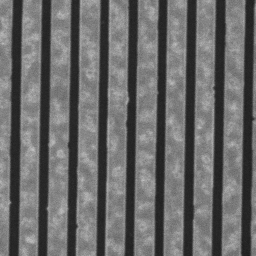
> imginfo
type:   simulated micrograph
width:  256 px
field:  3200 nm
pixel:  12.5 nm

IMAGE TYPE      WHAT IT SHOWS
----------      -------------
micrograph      parallel lines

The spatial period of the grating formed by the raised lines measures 29 px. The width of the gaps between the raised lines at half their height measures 133 nm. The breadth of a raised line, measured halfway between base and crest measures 222 nm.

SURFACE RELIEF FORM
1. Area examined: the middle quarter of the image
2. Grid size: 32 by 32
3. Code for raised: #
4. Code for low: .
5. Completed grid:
#...####....####...####...####..
#...####....####...####...####..
#...####....####...####...####..
#...####...####....####...####..
#...####...####....####...####..
#...####...####...#####...####..
#...####...####...#####...####..
#...####...#####..#####...####..
#...####...#####..#####...####..
#...####...#####...####...####..
#...####...####...#####...####..
#...####...####...#####...####..
#...####...####...#####...####..
#...####...####...#####...####..
#...####...####...#####...####..
#...####...####...#####...####..
#...####...####...#####...####..
#...####...####...#####...####..
#...####...####...#####...####..
#...####...####...#####...####..
#...####...####...#####...####..
#...####...####...#####...####..
#...####...####...#####...####..
#...####...####...#####...####..
#...####...####...#####...####..
#...####...####...#####...####..
#..#####...####...#####..#####..
#..#####...####...#####..#####..
#...####...####...#####...####..
#...####...####...#####...####..
#...####...####...#####..#####..
#...####...####...#####..#####..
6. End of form